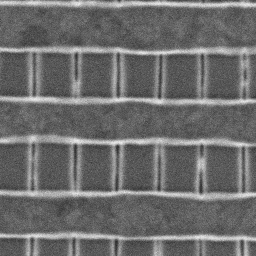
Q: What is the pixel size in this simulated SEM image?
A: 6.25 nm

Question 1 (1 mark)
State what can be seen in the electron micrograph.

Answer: wiring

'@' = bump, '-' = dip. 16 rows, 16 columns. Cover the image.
@@@@@@@@@@@@@@@@
@@@@@@@@@@@@@@@@
@@@@@@@@@@@@@@@@
----------------
----------------
----------------
@@@@@@@@@@@@@@@@
@@@@@@@@@@@@@@@@
@@@@@@@@@@@@@@@@
----------------
----------------
----------------
@@@@@@@@@@@@@@@@
@@@@@@@@@@@@@@@@
@@@@@@@@@@@@@@@@
----------------